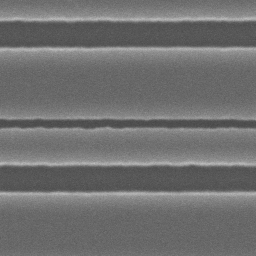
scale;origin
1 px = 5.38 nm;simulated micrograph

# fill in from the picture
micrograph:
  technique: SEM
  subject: lines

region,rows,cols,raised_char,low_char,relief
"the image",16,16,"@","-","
@@@@@@@@@@@@@@@@
----------------
----------------
@@@@@@@@@@@@@@@@
@@@@@@@@@@@@@@@@
@@@@@@@@@@@@@@@@
@@@@@@@@@@@@@@@@
@@@@@@@@@@@@@@@@
@@@@@@@@@@@@@@@@
@@@@@@@@@@@@@@@@
----------------
----------------
@@@@@@@@@@@@@@@@
@@@@@@@@@@@@@@@@
@@@@@@@@@@@@@@@@
@@@@@@@@@@@@@@@@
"